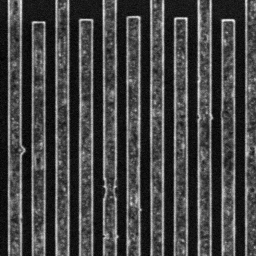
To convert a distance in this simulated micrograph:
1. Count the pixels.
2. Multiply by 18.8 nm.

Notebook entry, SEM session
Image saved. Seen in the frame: parallel lines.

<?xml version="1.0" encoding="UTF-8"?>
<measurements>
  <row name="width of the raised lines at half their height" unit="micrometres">0.23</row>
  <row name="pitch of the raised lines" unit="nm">445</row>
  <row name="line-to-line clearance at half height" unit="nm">214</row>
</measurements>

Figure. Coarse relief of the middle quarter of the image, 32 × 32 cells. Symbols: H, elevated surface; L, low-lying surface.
HLLLHHHLLLHHHLLLHHHLLLHHHLLLHHLL
HLLLHHHLLLHHHLLLHHHLLLHHHLLLHHLL
HLLLHHHLLLHHHLLLHHHLLLHHHLLLHHLL
HLLLHHHLLLHHHLLLHHHLLLHHHLLLHHLL
HLLLHHHLLLHHHLLLHHHLLLHHHLLLHHHL
HLLLHHHLLLHHHLLLHHHLLLHHHLLLHHHL
HLLLHHHLLLHHHLLLHHHLLLHHHLLLHHHL
HLLLHHHLLLHHHLLLHHHLLLHHHLLLHHHL
HLLLHHHLLLHHHLLLHHHLLLHHHLLLHHHL
HLLLHHHLLLHHHLLLHHHLLLHHHLLLHHHL
HLLLHHHLLLHHHLLLHHHLLLHHHLLLHHHL
HLLLHHHLLLHHHLLLHHHLLLHHHLLLHHHL
HLLLHHHLLLHHHLLLHHHLLLHHHLLLHHHL
HLLLHHHLLLHHHLLLHHHLLLHHHLLLHHHL
HLLLHHHLLLHHHLLLHHHLLLHHHLLLHHHL
HLLLHHHLLLHHHLLLHHHLLLHHHLLLHHHL
HLLLHHHLLLHHHLLLHHHLLLHHHLLLHHHL
HLLLHHHLLLHHHLLLHHHLLLHHHLLLHHHL
HLLLHHHLLLHHHLLLHHHLLLHHHLLLHHHL
HLLLHHHLLLHHHLLLHHHLLLHHHLLLHHHL
HLLLHHHLLLHHHLLLHHHLLLHHHLLLHHHL
HLLLHHHLLLHHHLLLHHHLLLHHHLLLHHHL
HLLLHHHLLLHHHLLLHHHLLLHHHLLLHHHL
HLLLHHHLLLHHHLLLHHHLLLHHHLLLHHHL
HLLLHHHLLLHHHLLLHHHLLLHHHLLLHHHL
HLLLHHHLLLHHHLLLHHHLLLHHHLLLHHHL
HLLLHHHLLLHHHLLLHHHLLLHHHLLLHHHL
HLLLHHHLLLHHHLLLHHHLLLHHHLLLHHHL
HLLLHHHLLLHHHLLLHHHLLLHHHLLLHHHL
HLLLHHHLLLHHHLLLHHHLLLHHHLLLHHHL
HLLLHHHLLLHHHLLLHHHLLLHHHLLLHHHL
HLLLHHHLLLHHLLLLHHHLLLHHHLLLHHHL